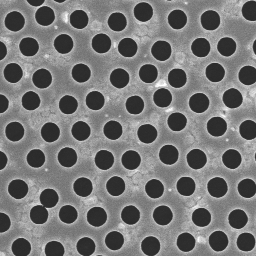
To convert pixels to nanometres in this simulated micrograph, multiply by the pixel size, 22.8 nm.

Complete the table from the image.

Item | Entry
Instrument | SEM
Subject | a regular array of holes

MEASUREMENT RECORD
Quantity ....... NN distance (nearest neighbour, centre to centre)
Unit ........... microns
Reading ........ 0.659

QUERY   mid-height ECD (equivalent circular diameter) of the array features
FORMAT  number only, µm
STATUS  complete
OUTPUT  0.451